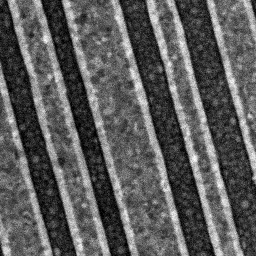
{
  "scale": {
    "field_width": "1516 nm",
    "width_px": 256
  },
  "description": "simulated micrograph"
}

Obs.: one or a few lines or trenches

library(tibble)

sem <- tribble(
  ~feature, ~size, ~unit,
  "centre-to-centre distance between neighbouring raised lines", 387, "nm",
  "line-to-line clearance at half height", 184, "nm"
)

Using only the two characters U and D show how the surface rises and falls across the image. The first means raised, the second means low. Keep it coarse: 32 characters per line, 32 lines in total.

DUUUUDDDUUUUUUUDDDDUUUDDDDUUUUUD
DDUUUDDDDUUUUUUDDDDUUUDDDDDUUUUD
DDUUUDDDDUUUUUUDDDDUUUDDDDDUUUUU
DDUUUUDDDUUUUUUDDDDDUUDDDDDUUUUU
DDDUUUDDDUUUUUUUDDDDUUUDDDDUUUUU
DDDUUUDDDDUUUUUUDDDDUUUDDDDDUUUU
DDDUUUUDDDUUUUUUDDDDUUUDDDDDUUUU
DDDUUUUDDDUUUUUUDDDDDUUDDDDDUUUU
DDDDUUUDDDUUUUUUUDDDDUUUDDDDUUUU
DDDDUUUDDDDUUUUUUDDDDUUUDDDDDUUU
DDDDUUUUDDDUUUUUUDDDDDUUDDDDDUUU
UDDDUUUUDDDUUUUUUUDDDDUUDDDDDUUU
UDDDDUUUDDDDUUUUUUDDDDUUUDDDDDUU
UDDDDUUUDDDDUUUUUUDDDDUUUDDDDDUU
UDDDDUUUUDDDUUUUUUDDDDDUUDDDDDUU
UUDDDUUUUDDDUUUUUUUDDDDUUUDDDDUU
UUDDDDUUUDDDDUUUUUUDDDDUUUDDDDDU
UUDDDDUUUDDDDUUUUUUDDDDUUUDDDDDU
UUDDDDUUUUDDDUUUUUUUDDDDUUDDDDDU
UUUDDDDUUUDDDUUUUUUUDDDDUUUDDDDU
UUUDDDDUUUDDDDUUUUUUDDDDUUUDDDDD
UUUDDDDUUUUDDDUUUUUUDDDDDUUDDDDD
UUUUDDDUUUUDDDUUUUUUUDDDDUUDDDDD
UUUUDDDDUUUDDDDUUUUUUDDDDUUUDDDD
UUUUDDDDUUUDDDDUUUUUUDDDDUUUDDDD
UUUUDDDDUUUUDDDUUUUUUDDDDDUUDDDD
UUUUUDDDDUUUDDDUUUUUUUDDDDUUDDDD
UUUUUDDDDUUUDDDDUUUUUUDDDDUUUDDD
UUUUUDDDDUUUDDDDUUUUUUDDDDUUUDDD
UUUUUDDDDUUUUDDDUUUUUUUDDDDUUDDD
DUUUUUDDDDUUUDDDUUUUUUUDDDDUUUDD
DUUUUUDDDDUUUDDDDUUUUUUDDDDUUUDD